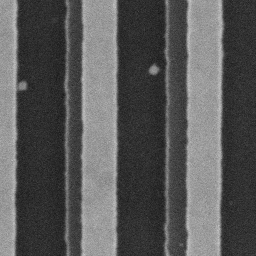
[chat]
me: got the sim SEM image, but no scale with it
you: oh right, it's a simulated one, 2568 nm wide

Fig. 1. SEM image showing lines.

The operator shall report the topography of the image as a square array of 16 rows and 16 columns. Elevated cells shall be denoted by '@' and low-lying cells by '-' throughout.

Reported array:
@---@@@---@@@@--
@---@@@---@@@@--
@---@@@---@@@@--
@---@@@---@@@@--
@---@@@---@@@@--
@---@@@---@@@@--
@---@@@---@@@@--
@---@@@---@@@@--
@---@@@---@@@@--
@---@@@---@@@@--
@---@@@---@@@@--
@---@@@---@@@@--
@---@@@---@@@@--
@---@@@---@@@@--
@---@@@---@@@@--
@---@@@---@@@@--